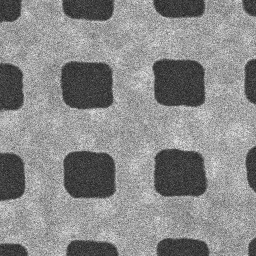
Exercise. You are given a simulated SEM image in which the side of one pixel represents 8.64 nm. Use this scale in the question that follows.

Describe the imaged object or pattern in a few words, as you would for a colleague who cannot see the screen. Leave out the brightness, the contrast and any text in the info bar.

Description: holes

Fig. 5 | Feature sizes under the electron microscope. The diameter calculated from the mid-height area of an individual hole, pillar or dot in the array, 464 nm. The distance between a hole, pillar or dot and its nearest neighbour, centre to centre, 778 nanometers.